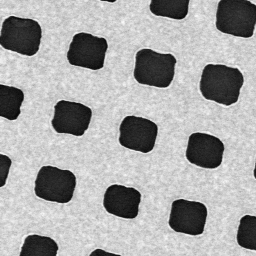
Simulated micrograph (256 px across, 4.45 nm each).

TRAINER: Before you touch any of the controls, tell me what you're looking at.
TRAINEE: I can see a regular array of holes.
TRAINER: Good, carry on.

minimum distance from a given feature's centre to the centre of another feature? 304 nm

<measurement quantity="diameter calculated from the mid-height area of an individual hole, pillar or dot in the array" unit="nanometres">172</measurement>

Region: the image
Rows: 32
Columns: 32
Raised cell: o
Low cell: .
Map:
ooooooooooooooooooo.....ooo.....
ooooooooooooooooooo....oooo.....
o...ooooooooooooooooooooooo.....
.....oooooooooooooooooooooo.....
.....oooo...ooooooooooooooooo..o
.....oooo....ooooooooooooooooooo
oo...ooo.....oooo...oooooooooooo
oooooooo.....oooo.....oooooooooo
oooooooooo...oooo.....oooo....oo
ooooooooooooooooo.....ooo.....oo
oooooooooooooooooo...oooo.....oo
...oooooooooooooooooooooo.....oo
...ooooooooooooooooooooooo....oo
...oooo....ooooooooooooooooooooo
..ooooo....ooooo.ooooooooooooooo
oooooo.....oooo....ooooooooooooo
ooooooo....oooo.....oooooooooooo
ooooooooooooooo.....oooo....oooo
oooooooooooooooo...oooo.....oooo
.oooooooooooooooooooooo.....oooo
.ooooooooooooooooooooooo....oooo
.oooo....ooooooooooooooooooooooo
.ooo......oooooooooooooooooooooo
oooo.....oooo....ooooooooooooooo
ooooo....oooo.....oooooooooooooo
ooooooooooooo....oooo....ooooooo
oooooooooooooo...oooo.....oooooo
ooooooooooooooooooooo.....oooo..
ooooooooooooooooooooo.....oooo..
ooo..ooooooooooooooooooooooooo..
ooo....ooooooooooooooooooooooo..
ooo....oooo...oooooooooooooooooo